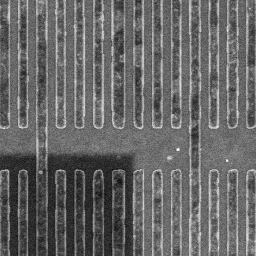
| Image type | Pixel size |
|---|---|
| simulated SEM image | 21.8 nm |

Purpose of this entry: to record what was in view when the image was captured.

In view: wiring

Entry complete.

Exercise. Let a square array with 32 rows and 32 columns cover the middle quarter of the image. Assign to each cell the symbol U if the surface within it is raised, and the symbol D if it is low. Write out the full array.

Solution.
DDDUUDDDUUDDUUUDDDUUDDUUDDDUUDDD
DDDUUDDDUUDDUUUDDDUUDDUUDDDUUDDD
DDDUUDDDUUDDUUUDDDUUDDUUDDDUUDDD
DDDUUDDDUUDDUUUDDDUUDDUUDDDUUDDD
DDDUUDDDUUDDUUUDDDUUDDUUDDDUUDDD
DDDUUDDDUUDDUUUDDDUUDDUUDDDUUDDD
DDDUUDDDUUDDUUUDDDUUDDUUDDDUUDDD
DDDUUDDDUUDDUUUDDDUUDDUUDDDUUDDD
DDDUUDDDUUDDUUUDDDUUDDUUDDDUUDDD
DDDUUDDDUUDDUUUDDDUUDDUUDDDUUDDD
DDDUUDDDUUDDUUUDDDUUDDUUDDDUUDDD
DDDUUDDDUUDDUUUDDDUUDDUUDDDUUDDD
DDDUUDDDUUDDUUUDDDUUDDUUDDDUUDDD
DDDUUDDDUUDDUUUDDDUUDDUUDDDUUDDD
DDDUUDDDUUDDUUUDDDUUDDUUDDDUUDDD
DDDUUDDDUDDDDUUDDDUUDDUUDDDUUDDD
DDDDDDDDDDDDDDDDDDDDDDDDDDDDDDDD
DDDDDDDDDDDDDDDDDDDDDDDDDDDDDDDD
DDDDDDDDDDDDDDDDDDDDDDDDDDDDDDDD
DDDDDDDDDDDDDDDDDDDDDDDDDDDDDDDD
DDDDDDDDDDDDDDDDDDDDDDDDDDDDDDDD
DDDDDDDDDDDDDDDDDDDDDDDDDDDDDDDD
DDDDDDDDDDDDDDDDDDDDDDDDDDDDDDDD
DDDDDDDDDDDDDDDDDDDDDDDDDDDDDDDD
DDDDDDDDDDDDDDDDDDDDDDDDDDDDDDDD
DDDDDDDDDDDDDDDDDDDDDDDDDDDDDDDD
DDDDDDDDDDDDDDDDDDDDDDDDDDDDDDDD
DDDUUDDDUDDDUUUDDDUUDDUUDDDUUDDD
DDDUUDDDUUDDUUUDDDUUDDUUDDDUUDDD
DDDUUDDUUUDDUUUDDDUUDDUUDDDUUDDD
DDDUUDDUUUDDUUUDDDUUDDUUDDDUUDDD
DDDUUDDUUUDDUUUDDDUUDDUUDDDUUDDD